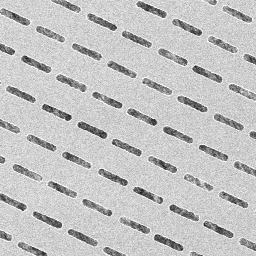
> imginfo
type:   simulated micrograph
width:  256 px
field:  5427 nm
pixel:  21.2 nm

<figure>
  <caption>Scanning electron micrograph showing a regular array of holes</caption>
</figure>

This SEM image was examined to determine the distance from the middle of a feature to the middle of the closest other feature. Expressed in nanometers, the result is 704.